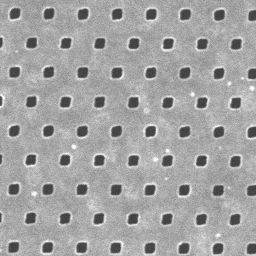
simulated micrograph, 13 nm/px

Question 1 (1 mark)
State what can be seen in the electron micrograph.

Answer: a regular array of holes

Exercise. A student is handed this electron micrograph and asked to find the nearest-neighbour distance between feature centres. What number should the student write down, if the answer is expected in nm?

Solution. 434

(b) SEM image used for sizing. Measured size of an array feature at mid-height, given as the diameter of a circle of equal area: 154 nm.